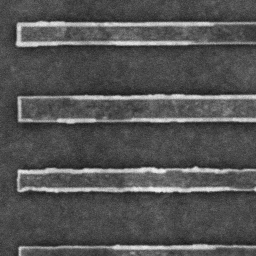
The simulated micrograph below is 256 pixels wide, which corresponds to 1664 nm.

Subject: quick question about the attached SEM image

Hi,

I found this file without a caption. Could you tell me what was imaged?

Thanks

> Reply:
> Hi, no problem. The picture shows one or a few lines or trenches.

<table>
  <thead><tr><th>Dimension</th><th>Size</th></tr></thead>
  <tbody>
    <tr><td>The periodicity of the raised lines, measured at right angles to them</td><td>0.476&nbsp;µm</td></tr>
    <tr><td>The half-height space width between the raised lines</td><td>0.334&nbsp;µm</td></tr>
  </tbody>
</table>